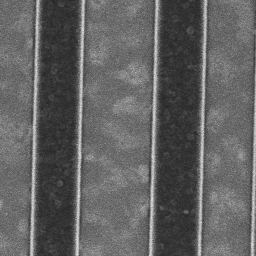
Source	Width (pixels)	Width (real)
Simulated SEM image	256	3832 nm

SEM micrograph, one or a few lines or trenches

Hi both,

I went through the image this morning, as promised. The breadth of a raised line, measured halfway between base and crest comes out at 0.722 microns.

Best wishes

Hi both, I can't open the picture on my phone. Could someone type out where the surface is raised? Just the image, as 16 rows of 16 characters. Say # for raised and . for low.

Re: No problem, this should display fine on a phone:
..###.....###...
..###.....###...
..###.....###...
..###.....###...
..###.....###...
..###.....###...
..###.....###...
..###.....###...
..###.....###...
..###.....###...
..###.....###...
..###....####...
..###....####...
..###....####...
..###....####...
..###....###....